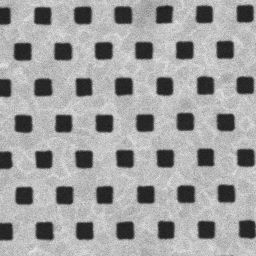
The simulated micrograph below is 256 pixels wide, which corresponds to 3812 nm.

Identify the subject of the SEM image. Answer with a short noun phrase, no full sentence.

a regular array of holes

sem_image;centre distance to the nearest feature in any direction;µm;0.595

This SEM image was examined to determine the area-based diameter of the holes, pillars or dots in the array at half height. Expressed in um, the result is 0.292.